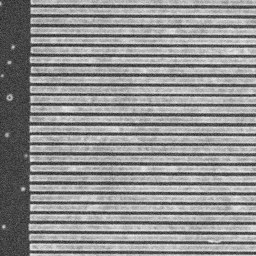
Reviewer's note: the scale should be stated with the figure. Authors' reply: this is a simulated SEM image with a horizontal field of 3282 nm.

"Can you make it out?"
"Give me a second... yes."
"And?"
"parallel lines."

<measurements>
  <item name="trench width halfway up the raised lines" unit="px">4.75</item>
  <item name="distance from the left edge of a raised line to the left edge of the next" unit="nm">126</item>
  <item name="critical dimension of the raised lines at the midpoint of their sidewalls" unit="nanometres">68.9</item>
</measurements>